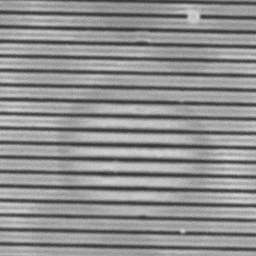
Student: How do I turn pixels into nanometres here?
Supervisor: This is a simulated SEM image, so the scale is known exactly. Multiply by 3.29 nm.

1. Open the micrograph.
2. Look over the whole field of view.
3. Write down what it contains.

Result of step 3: parallel lines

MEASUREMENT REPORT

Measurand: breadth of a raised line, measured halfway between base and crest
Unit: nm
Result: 34.9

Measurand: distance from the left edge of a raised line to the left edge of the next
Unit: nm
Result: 47.5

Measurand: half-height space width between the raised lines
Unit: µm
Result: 0.0144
